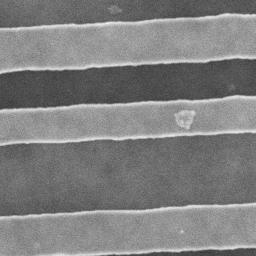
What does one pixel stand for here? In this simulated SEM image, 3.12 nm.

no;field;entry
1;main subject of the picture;lines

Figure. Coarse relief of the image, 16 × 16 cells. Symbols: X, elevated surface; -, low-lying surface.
----------------
------XXXXXXXXXX
XXXXXXXXXXXXXXXX
XXXXXXXXXXXXXXXX
X---------------
----------------
--------XXXXXXXX
XXXXXXXXXXXXXXXX
XXXXXXXXXXX-----
----------------
----------------
----------------
----------------
-XXXXXXXXXXXXXXX
XXXXXXXXXXXXXXXX
XXXXXXXXXXXXXXX-